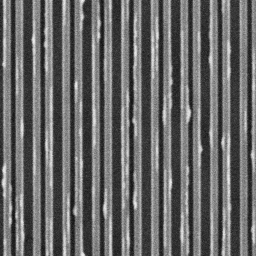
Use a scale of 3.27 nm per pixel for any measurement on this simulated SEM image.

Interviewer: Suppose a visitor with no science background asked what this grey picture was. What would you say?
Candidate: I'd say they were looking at parallel lines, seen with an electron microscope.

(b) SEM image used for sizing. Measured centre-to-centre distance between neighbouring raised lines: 48.3 nanometers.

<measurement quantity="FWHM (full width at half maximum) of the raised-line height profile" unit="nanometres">23.7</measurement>